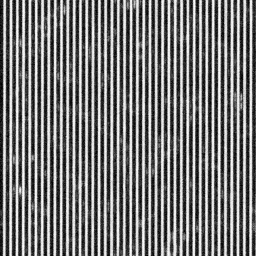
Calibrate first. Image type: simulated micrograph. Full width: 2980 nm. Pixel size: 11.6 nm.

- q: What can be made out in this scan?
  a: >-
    parallel lines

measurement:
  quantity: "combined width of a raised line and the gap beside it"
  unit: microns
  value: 0.0735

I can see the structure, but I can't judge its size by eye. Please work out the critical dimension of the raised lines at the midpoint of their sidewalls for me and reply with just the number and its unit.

14.6 nanometers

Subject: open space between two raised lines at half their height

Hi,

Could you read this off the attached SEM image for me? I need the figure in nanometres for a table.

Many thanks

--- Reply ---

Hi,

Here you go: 55.3